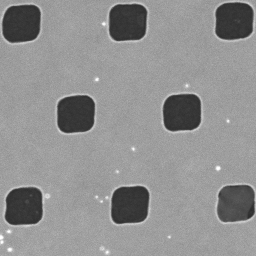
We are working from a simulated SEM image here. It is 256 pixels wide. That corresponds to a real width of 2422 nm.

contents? a regular array of holes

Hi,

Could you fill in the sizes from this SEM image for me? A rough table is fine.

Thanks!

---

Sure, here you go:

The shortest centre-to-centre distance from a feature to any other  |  998 nm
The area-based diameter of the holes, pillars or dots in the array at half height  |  380 nanometres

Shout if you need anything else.